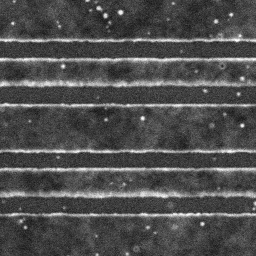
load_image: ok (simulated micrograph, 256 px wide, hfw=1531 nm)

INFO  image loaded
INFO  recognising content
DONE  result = lines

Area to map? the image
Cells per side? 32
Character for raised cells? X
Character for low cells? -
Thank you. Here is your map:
XXXXXXXXXXXXXXXXXXXXXXXXXXXXXXXX
XXXXXXXXXXXXXXXXXXXXXXXXXXXXXXXX
XXXXXXXXXXXXXXXXXXXXXXXXXXXXXXXX
XXXXXXXXXXXXXXXXXXXXXXXXXXXXXXXX
XXXXXXXXXXXXXXXXXXXXXXXXXXXXXXXX
--------------------------------
--------------------------------
XXXXXXXXXXXXXXXXXXXXXXXXXXXXXXXX
XXXXXXXXXXXXXXXXXXXXXXXXXXXXXXXX
XXXXXXXXXXXXXXXXXXXXXXXXXXXXXXXX
XXXXXXXXXXXXXXXXXXXX--XXXXXXXXXX
--------------------------------
--------------------------------
XXXXXXXXXXXXXXXXXXXXXXXXXXXXXXXX
XXXXXXXXXXXXXXXXXXXXXXXXXXXXXXXX
XXXXXXXXXXXXXXXXXXXXXXXXXXXXXXXX
XXXXXXXXXXXXXXXXXXXXXXXXXXXXXXXX
XXXXXXXXXXXXXXXXXXXXXXXXXXXXXXXX
XXXXXXXXXXXXXXXXXXXXXXXXXXXXXXXX
--------------------------------
--------------------------------
XXXXXXXXXXXXXXXXXXXXXXXXXXXXXXXX
XXXXXXXXXXXXXXXXXXXXXXXXXXXXXXXX
XXXXXXXXXXXXXXXXXXXXXXXXXXXXXXXX
-----------XX-------X-X--------X
--------------------------------
--------------------------------
XXXXXXXXXXXXXXXXXXXXXXXXXXXXXXXX
XXXXXXXXXXXXXXXXXXXXXXXXXXXXXXXX
XXXXXXXXXXXXXXXXXXXXXXXXXXXXXXXX
XXXXXXXXXXXXXXXXXXXXXXXXXXXXXXXX
XXXXXXXXXXXXXXXXXXXXXXXXXXXXXXXX